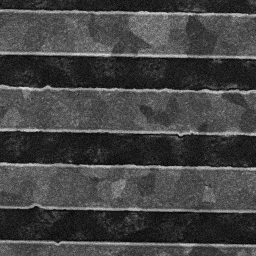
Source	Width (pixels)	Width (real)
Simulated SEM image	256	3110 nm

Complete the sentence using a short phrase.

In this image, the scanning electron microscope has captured one or a few lines or trenches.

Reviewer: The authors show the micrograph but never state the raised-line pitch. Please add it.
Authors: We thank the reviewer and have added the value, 935 nanometres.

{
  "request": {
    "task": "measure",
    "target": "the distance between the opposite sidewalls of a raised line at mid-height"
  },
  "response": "516 nm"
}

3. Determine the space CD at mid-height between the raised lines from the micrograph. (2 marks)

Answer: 424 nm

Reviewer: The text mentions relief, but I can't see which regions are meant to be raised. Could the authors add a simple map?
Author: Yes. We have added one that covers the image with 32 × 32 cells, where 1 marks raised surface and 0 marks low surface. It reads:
00000000000000000000000000000000
11111100010000000000000000000000
11111111111111111111111111111111
11111111111111111111111111111111
11111111111111111111111111111111
11111111111111111111111111111111
11111111111111111111111111111111
00000000000000000000000000000000
00000000000000000000000000000000
00000000000000000000000000000000
00000000000000000000000000000000
11111111111111111111111101101101
11111111111111111111111111111111
11111111111111111111111111111111
11111111111111111111111111111111
11111111111111111111111111111111
00000000000000000011111111111111
00000000000000000000000000000000
00000000000000000000000000000000
00000000000000000000000000000000
00000000000000000000000000000000
11111111111111111111111111111111
11111111111111111111111111111111
11111111111111111111111111111111
11111111111111111111111111111111
11111111111111111111111111111111
00000000000000000000000000000000
00000000000000000000000000000000
00000000000000000000000000000000
00000000000000000000000000000000
11111111111111110000000000000000
11111111111111111111111111111111